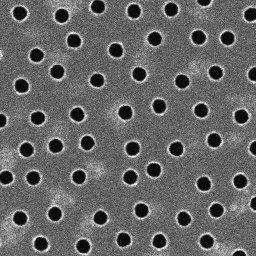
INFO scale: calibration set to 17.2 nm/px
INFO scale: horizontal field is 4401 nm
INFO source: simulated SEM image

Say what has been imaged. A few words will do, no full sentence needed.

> a regular array of holes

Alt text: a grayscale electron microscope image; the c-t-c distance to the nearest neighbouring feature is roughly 0.561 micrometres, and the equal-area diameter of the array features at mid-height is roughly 240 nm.